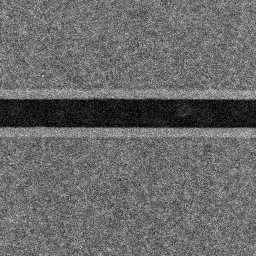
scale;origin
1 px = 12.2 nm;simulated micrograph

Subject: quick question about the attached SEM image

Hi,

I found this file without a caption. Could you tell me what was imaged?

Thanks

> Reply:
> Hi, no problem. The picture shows one or a few lines or trenches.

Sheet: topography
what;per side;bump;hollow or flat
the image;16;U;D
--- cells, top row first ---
UUUUUUUUUUUUUUUU
UUUUUUUUUUUUUUUU
UUUUUUUUUUUUUUUU
UUUUUUUUUUUUUUUU
UUUUUUUUUUUUUUUU
UUUUUUUUUUUUUUUU
DDDDDDDDDDDDDDDD
DDDDDDDDDDDDDDDD
UUUUUUUUUUUUUUUU
UUUUUUUUUUUUUUUU
UUUUUUUUUUUUUUUU
UUUUUUUUUUUUUUUU
UUUUUUUUUUUUUUUU
UUUUUUUUUUUUUUUU
UUUUUUUUUUUUUUUU
UUUUUUUUUUUUUUUU